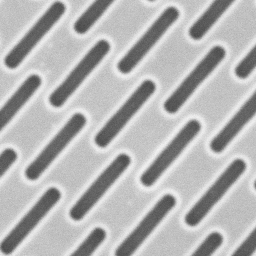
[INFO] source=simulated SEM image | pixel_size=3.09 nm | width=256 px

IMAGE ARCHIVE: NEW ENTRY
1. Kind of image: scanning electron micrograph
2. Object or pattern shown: a regular array of holes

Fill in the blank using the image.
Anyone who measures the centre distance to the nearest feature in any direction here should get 186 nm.